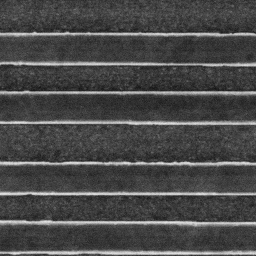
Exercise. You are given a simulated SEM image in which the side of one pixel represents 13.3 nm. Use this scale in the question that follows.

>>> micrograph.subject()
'lines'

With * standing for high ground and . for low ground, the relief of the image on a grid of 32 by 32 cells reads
................................
................................
................................
................................
********************************
********************************
********************************
********************************
................................
................................
................................
................................
********************************
********************************
********************************
......................***.*****.
................................
................................
................................
................................
********************************
********************************
********************************
********************************
................................
................................
................................
................................
********************************
********************************
********************************
********************************